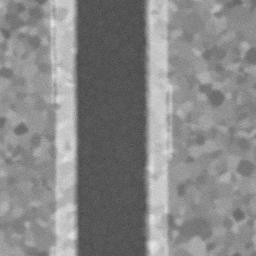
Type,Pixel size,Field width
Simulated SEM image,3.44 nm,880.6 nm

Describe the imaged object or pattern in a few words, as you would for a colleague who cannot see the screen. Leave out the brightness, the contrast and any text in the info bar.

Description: one or a few lines or trenches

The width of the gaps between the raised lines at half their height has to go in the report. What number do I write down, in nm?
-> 324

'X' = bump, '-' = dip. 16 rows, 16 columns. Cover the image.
XXXX------XXXXXX
XXXX------XXXXXX
XXXX------XXXXXX
XXXX------XXXXXX
XXXX------XXXXXX
XXXX------XXXXXX
XXXX------XXXXXX
XXXX------XXXXXX
XXXX------XXXXXX
XXXX------XXXXXX
XXXX------XXXXXX
XXXX------XXXXXX
XXXX------XXXXXX
XXXX------XXXXXX
XXXX------XXXXXX
XXXX------XXXXXX